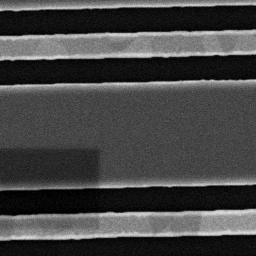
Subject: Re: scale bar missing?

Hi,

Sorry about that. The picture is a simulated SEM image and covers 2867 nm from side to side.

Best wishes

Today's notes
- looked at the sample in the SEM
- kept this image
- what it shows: lines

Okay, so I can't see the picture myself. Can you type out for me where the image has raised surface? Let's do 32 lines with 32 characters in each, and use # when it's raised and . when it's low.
################################
................................
................................
................................
...#############################
################################
################################
#...............................
................................
................................
......##########################
################################
################################
################################
################################
################################
################################
################################
################################
################################
################################
################################
################################
##########......................
................................
................................
.......................#########
################################
################################
######################..........
................................
................................